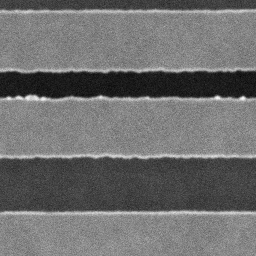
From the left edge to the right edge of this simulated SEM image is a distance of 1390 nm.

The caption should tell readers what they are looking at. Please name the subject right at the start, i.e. lines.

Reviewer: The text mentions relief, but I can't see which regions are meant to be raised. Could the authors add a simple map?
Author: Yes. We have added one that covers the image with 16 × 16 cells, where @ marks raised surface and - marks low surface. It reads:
----------------
@@@@@@@@@@@@@@@@
@@@@@@@@@@@@@@@@
@@@@@@@@@@@@@@@@
----------------
----------------
@@@@@@@@@@@@@@@@
@@@@@@@@@@@@@@@@
@@@@@@@@@@@@@@@@
@@@@@@@@@@@@@@@@
----------------
----------------
----------------
@@@@@@@@@@@@@@@@
@@@@@@@@@@@@@@@@
@@@@@@@@@@@@@@@@